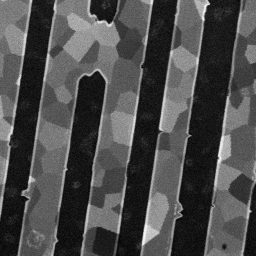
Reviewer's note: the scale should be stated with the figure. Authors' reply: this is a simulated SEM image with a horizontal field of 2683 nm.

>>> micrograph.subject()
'one or a few lines or trenches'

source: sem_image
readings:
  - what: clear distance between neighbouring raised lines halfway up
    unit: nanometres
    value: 278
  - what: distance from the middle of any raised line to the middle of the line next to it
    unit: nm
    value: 633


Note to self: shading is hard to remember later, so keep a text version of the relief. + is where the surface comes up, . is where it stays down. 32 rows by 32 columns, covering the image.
++++...++++....++++...++++....++
++++...++++....++++...++++....++
+++....+++++..+++++...+++.....++
+++....+++++++++++....+++.....++
+++...++++++++++++....+++.....++
+++...++++++++++++....+++....+++
+++...++++++++++++...++++....+++
+++...++++++++++++...++++....+++
+++...++++++++++++...++++....+++
++....++++...+++++...+++.....+++
++....++++...++++....+++.....+++
++...+++++...++++....+++.....+++
++...++++....++++...++++....++++
++...++++....++++...++++....++++
++...++++....++++...++++....++++
++...++++....++++...++++....++++
+....++++...+++++...+++.....++++
+....++++...++++....+++.....++++
+...+++++...++++....+++.....++++
+...++++....++++...++++....+++++
+...++++....++++...++++....+++++
+...++++....++++...++++....+++++
+...++++....++++...++++....+++++
...+++++...+++++...+++.....+++++
...+++++...++++....+++.....++++.
...++++....++++....+++.....++++.
...++++....++++...+++++...+++++.
...++++....++++...++++....+++++.
...++++....++++...++++....+++++.
...++++....++++...+++.....+++++.
...++++...+++++...+++.....+++++.
..+++++...++++....+++.....++++..